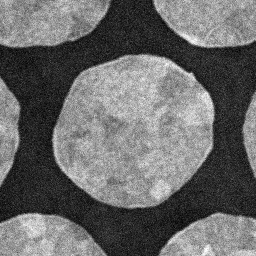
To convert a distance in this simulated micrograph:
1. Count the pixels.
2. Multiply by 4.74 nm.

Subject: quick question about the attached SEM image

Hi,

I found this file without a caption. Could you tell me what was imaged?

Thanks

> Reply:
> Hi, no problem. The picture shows raised bodies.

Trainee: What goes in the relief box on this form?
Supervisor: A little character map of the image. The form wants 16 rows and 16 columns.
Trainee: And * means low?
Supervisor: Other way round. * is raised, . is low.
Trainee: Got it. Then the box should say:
*******...******
******.....*****
****........****
........**......
.....*******....
....*********...
*...*********...
*...*********..*
*..**********..*
*..**********..*
*...********....
.....*******....
......****......
.***.........**.
*****......*****
******....******